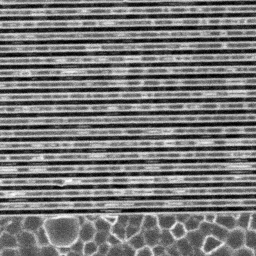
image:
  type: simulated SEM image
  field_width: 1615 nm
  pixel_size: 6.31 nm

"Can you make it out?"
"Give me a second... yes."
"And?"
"parallel lines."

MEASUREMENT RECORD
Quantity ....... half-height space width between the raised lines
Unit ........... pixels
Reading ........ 5.37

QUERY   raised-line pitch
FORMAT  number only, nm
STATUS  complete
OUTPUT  76.4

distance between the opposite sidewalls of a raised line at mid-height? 0.0394 microns